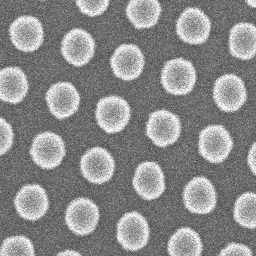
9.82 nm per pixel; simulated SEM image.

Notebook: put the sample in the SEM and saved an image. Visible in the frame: a regular array of raised bodies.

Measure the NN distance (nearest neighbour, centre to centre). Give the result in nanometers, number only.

515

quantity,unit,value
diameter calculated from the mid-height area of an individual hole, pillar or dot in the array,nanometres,326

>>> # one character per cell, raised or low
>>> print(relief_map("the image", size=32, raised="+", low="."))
..........+++...++++...........+
..........+++...++++...++.......
..++............++++..++++......
.++++.................++++...+++
.++++...+++............+++...+++
..+++...++++.................+++
........++++...+++...........+++
.........++...++++....+.........
..............++++...+++........
+++............++...++++....+...
+++....++...........++++...+++..
+++...++++...........++....++++.
++....++++...++............+++..
......++++..++++............++..
.......++...++++...+++..........
+...........++++..++++..........
+.................++++...+++....
+...++++...........+++...++++...
+...++++.................++++..+
....++++..++++............++...+
.....++...++++....+............+
..........++++...+++............
...........++....+++....++......
...++............+++...++++.....
..++++............++...++++...++
..++++...+++...........++++..+++
..++++..++++............++...+++
........++++...+++............++
.........+++...+++..............
...............+++....+++.......
++++...........+++...++++.......
++++....+............++++...+++.